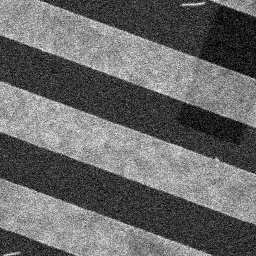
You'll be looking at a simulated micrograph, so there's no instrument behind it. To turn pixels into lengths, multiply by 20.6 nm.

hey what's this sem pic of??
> one or a few lines or trenches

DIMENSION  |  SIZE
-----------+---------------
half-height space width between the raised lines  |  922 nm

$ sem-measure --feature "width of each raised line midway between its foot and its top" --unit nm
947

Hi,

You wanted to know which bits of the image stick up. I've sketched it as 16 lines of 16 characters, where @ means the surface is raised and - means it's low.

@@@@-----------@
@@@@@@----------
-@@@@@@@@-------
----@@@@@@@@----
------@@@@@@@@@-
@--------@@@@@@@
@@@@--------@@@@
@@@@@@@--------@
-@@@@@@@@-------
----@@@@@@@@----
------@@@@@@@@@-
@--------@@@@@@@
@@@@--------@@@@
@@@@@@---------@
-@@@@@@@@-------
----@@@@@@@@----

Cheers